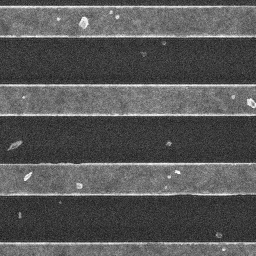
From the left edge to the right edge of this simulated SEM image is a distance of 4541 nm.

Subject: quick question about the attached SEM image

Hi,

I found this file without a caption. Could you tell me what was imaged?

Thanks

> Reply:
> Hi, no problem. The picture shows lines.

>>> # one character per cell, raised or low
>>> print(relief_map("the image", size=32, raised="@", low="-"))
--------------------------------
@@@@@@@@@@@@@@@@@@@@@@@@@@@@@@@@
@@@@@@@@@@@@@@@@@@@@@@@@@@@@@@@@
@@@@@@@@@@@@@@@@@@@@@@@@@@@@@@@@
@@@@@@@@@@@@@@@@@@@@@@@@@@@@@@@@
--------------------------------
--------------------------------
--------------------------------
--------------------------------
--------------------------------
--------------------------------
@@@@@@@@@@@@@@@@@@@@@@@@@@@@@@@@
@@@@@@@@@@@@@@@@@@@@@@@@@@@@@@@@
@@@@@@@@@@@@@@@@@@@@@@@@@@@@@@@@
--------------------------------
--------------------------------
--------------------------------
--------------------------------
--------------------------------
--------------------------------
--------@-@@@@@@@@@@@@@@@@@@@@@@
@@@@@@@@@@@@@@@@@@@@@@@@@@@@@@@@
@@@@@@@@@@@@@@@@@@@@@@@@@@@@@@@@
@@@@@@@@@@@@@@@@@@@@@@@@@@@@@@@@
--------------------------------
--------------------------------
--------------------------------
--------------------------------
--------------------------------
--------------------------------
@@@@@@@@@@@@@@@@@@@@@@@@@@@@@@@@
@@@@@@@@@@@@@@@@@@@@@@@@@@@@@@@@